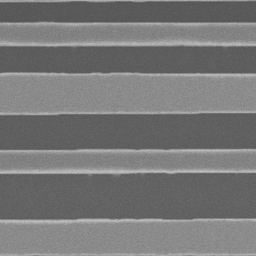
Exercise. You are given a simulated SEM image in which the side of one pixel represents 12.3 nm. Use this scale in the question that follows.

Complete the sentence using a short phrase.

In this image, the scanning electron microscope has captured lines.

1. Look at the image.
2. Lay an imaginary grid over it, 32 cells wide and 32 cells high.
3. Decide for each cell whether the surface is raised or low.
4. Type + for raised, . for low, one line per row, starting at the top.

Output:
................................
................................
................................
++++++++++++++++++++++++++++++++
++++++++++++++++++++++++++++++++
++++++++++++++++++++++++++++++++
................................
................................
................................
++++++++++++++++++++++++++++++++
++++++++++++++++++++++++++++++++
++++++++++++++++++++++++++++++++
++++++++++++++++++++++++++++++++
++++++++++++++++++++++++++++++++
................................
................................
................................
................................
................................
++++++++++++++++++++++++++++++++
++++++++++++++++++++++++++++++++
++++++++++++++++++++++++++++++++
................................
................................
................................
................................
................................
..........++++.++.++....++++++++
++++++++++++++++++++++++++++++++
++++++++++++++++++++++++++++++++
++++++++++++++++++++++++++++++++
++++++++++++++++++++++++++++++++